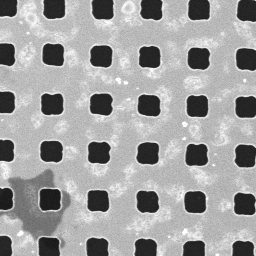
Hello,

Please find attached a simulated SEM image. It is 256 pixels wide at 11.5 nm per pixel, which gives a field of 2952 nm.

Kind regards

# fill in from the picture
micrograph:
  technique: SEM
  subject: a regular array of holes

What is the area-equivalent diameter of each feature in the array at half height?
0.272 µm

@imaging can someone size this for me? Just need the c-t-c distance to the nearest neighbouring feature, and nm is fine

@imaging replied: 550